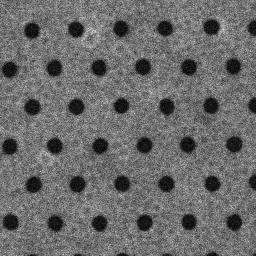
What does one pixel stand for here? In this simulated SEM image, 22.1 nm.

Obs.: a regular array of holes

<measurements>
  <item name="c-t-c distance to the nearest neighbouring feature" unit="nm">975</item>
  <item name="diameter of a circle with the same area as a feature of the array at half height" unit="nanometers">359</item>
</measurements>